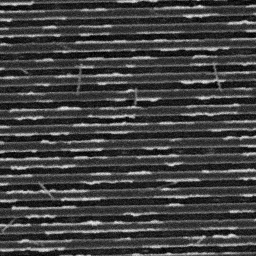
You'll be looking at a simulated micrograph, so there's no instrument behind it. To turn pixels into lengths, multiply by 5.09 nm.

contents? parallel lines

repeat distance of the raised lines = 16.4 px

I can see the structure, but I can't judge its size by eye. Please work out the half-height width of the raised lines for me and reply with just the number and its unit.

50.2 nanometers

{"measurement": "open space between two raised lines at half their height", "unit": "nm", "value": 35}